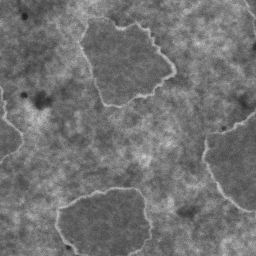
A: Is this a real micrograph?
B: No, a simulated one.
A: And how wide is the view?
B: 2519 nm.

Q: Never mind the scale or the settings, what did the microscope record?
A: raised bodies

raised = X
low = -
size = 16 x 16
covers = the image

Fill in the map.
----------------
-----XX---------
-----XXXXX------
-----XXXXX------
------XXXXX-----
------XXXX------
-------X--------
---------------X
X------------XXX
X------------XXX
-------------XXX
--------------XX
-----XXXX-----XX
----XXXXX-------
----XXXXX-------
-----XXXX-------